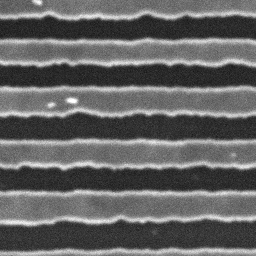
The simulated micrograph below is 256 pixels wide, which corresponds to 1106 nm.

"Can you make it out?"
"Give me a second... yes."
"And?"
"lines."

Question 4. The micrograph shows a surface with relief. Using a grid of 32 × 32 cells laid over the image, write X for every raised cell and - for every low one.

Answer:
XXXXXXXXXXXXXXXXXXXXXXXXXXXXXXXX
XXXXXXXXXXXXXXXXXXXXXXXXXXXXXXXX
--------------------------------
--------------------------------
--------------------------------
XXXXXXXXXXXXXXXXXXXXXXXXXXXXXXXX
XXXXXXXXXXXXXXXXXXXXXXXXXXXXXXXX
XXXXXXXXXXXXXXXXXXXXXXXXXXXXXXXX
--------------------------------
--------------------------------
--------------------------------
XXXXXXXXXXXXXXXXXXXXXXXXXXXXXXXX
XXXXXXXXXXXXXXXXXXXXXXXXXXXXXXXX
XXXXXXXXXXXXXXXXXXXXXXXXXXXXXXXX
X--X---X-----XX------------XXXX-
--------------------------------
--------------------------------
--------------------------------
XXXXXXXXXXXXXXXXXXXXXXXXXXXXXXXX
XXXXXXXXXXXXXXXXXXXXXXXXXXXXXXXX
XXXXXXXXXXXXXXXXXXXXXXXXXXXXXXXX
--------------------------------
--------------------------------
--------------------------------
XXXXXXXXXXXXXXXXXXXXXXXXXXXXXXXX
XXXXXXXXXXXXXXXXXXXXXXXXXXXXXXXX
XXXXXXXXXXXXXXXXXXXXXXXXXXXXXXXX
XXXXXXXX-XXXXXX-XXXXX-XX----XX--
--------------------------------
--------------------------------
--------------------------------
----XXXXXXXXXXXXXXXXXXXXXXXXXXXX